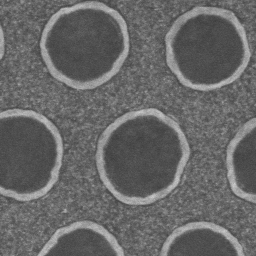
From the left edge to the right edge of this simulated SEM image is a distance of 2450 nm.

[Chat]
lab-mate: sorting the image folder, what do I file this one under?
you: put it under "raised bodies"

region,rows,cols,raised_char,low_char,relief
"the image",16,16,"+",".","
.....++.........
...+++++...++++.
...+++++...++++.
...+++++...++++.
...++++....++++.
................
................
+++.....++......
++++...++++....+
++++..++++++..++
++++..+++++...++
+++....++++....+
........+.......
................
....++.....+++..
...++++...+++++.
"